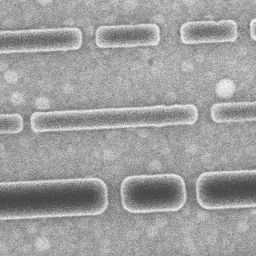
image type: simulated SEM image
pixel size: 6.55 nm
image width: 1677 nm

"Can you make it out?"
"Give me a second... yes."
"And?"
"one or a few lines or trenches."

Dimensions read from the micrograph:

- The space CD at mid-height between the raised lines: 349 nanometres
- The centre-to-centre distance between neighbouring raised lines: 518 nm